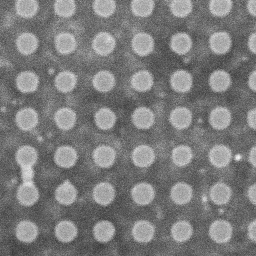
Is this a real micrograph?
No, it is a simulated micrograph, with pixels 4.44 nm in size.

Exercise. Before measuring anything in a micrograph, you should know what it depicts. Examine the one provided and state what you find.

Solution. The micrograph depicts a regular array of raised bodies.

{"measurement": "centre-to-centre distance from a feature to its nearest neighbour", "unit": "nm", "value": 166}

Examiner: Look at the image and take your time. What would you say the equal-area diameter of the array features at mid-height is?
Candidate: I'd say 92.5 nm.